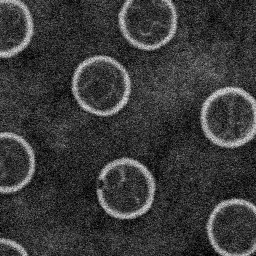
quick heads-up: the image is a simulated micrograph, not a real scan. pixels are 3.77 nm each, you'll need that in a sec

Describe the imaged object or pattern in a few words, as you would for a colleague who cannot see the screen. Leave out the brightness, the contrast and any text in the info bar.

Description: raised bodies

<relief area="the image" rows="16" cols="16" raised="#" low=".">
#.......###.....
##......###.....
##......##......
................
.....###........
.....###........
.....###.....###
.............###
#............###
##..............
##.....##.......
#.....###.......
......###.......
.......#.....###
.............###
#.............##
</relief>